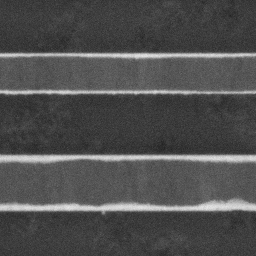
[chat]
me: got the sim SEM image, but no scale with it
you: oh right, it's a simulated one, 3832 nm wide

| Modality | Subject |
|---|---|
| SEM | lines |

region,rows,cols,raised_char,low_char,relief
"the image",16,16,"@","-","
----------------
----------------
----------------
@@@@@@@@@@@@@@@@
@@@@@@@@@@@@@@@@
@@@@@@@@@@@@@@@@
----------------
----------------
----------------
----------------
@@@@@@@@@@@@@@@@
@@@@@@@@@@@@@@@@
@@@@@@@@@@@@@@@@
----------------
----------------
----------------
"